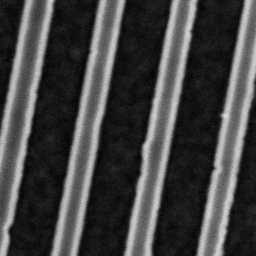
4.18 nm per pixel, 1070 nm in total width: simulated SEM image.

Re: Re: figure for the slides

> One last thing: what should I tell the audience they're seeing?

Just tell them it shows one or a few lines or trenches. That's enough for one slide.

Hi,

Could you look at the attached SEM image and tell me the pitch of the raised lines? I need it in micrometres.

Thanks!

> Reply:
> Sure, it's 0.297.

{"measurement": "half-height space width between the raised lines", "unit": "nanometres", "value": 214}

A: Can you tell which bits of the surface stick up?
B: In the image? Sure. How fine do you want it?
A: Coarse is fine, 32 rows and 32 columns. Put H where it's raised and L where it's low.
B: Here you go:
LLLHHHLLLLLLLHHLLLLLLLHHLLLLLLLH
LLLHHHLLLLLLHHHLLLLLLLHHLLLLLLLH
LLLHHHLLLLLLHHHLLLLLLHHHLLLLLLHH
LLLHHHLLLLLLHHHLLLLLLHHHLLLLLLHH
LLLHHHLLLLLLHHHLLLLLLHHHLLLLLLHH
LLHHHLLLLLLLHHLLLLLLLHHLLLLLLLHH
LLHHHLLLLLLLHHLLLLLLLHHLLLLLLLHH
LLHHHLLLLLLHHHLLLLLLHHHLLLLLLLHH
LLHHHLLLLLLHHHLLLLLLHHHLLLLLLHHH
LLHHHLLLLLLHHHLLLLLLHHHLLLLLLHHH
LHHHHLLLLLLHHLLLLLLLHHLLLLLLLHHL
LHHHLLLLLLLHHLLLLLLLHHLLLLLLLHHL
LHHHLLLLLLHHHLLLLLLHHHLLLLLLLHHL
LHHHLLLLLLHHHLLLLLLHHHLLLLLLHHHL
LHHHLLLLLLHHHLLLLLLHHHLLLLLLHHHL
LHHHLLLLLLHHLLLLLLLHHLLLLLLLHHHL
HHHHLLLLLLHHLLLLLLLHHLLLLLLLHHLL
HHHLLLLLLHHHLLLLLLLHHLLLLLLLHHLL
HHHLLLLLLHHHLLLLLLHHHLLLLLLHHHLL
HHHLLLLLLHHHLLLLLLHHHLLLLLLHHHLL
HHHLLLLLLHHHLLLLLLHHHLLLLLLHHHLL
HHLLLLLLLHHLLLLLLLHHLLLLLLLHHLLL
HHLLLLLLLHHLLLLLLLHHLLLLLLLHHLLL
HHLLLLLLHHHLLLLLLHHHLLLLLLLHHLLL
HHLLLLLLHHHLLLLLLHHHLLLLLLHHHLLL
HHLLLLLLHHLLLLLLLHHHLLLLLLHHHLLL
HHLLLLLLHHLLLLLLLHHLLLLLLLHHLLLL
HLLLLLLLHHLLLLLLLHHLLLLLLLHHLLLL
HLLLLLLHHHLLLLLLHHHLLLLLLLHHLLLL
HLLLLLLHHHLLLLLLHHHLLLLLLHHHLLLL
HLLLLLLHHHLLLLLLHHHLLLLLLHHHLLLL
HLLLLLLHHLLLLLLLHHHLLLLLLHHLLLLL